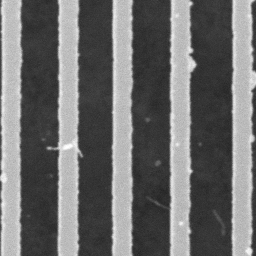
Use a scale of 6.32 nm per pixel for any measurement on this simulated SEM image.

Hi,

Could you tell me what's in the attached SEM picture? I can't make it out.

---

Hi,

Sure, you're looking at lines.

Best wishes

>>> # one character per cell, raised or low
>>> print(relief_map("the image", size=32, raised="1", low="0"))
11100001110000110000011100000110
11000001110000110000011100000110
11000001110000110000011100000110
11100001110000110000011100000110
11100001110000110000011100000110
11000001110000110000011100000110
11100001110000110000011100000110
11100001110000110000011100000111
11100001110000110000011100000110
11000001110000110000011100000111
11100001110000110000011100000111
11000001110000110000011100000110
11100001110000110000011100000110
11000001110000110000011100000110
11000001110000110000011100000110
11000001110000110000011100000110
11000001110000110000011100000110
11000001110000110000011100000110
11000001110000110000011100000110
11000001110000110000011100000110
11000001110000110000011100000110
11000001110000110000011100000110
11000001110000110000011100000110
11000001110000110000011100000111
11000001110000110000011100000110
11000001110000110000011100000110
11000001110000110000011100000110
11000001110000110000011100000110
11100001110000110000011100000110
11000001110000110000011100000110
11000001110000110000011100000110
11000001110000110000011100000110